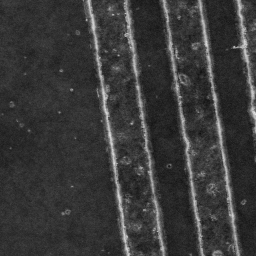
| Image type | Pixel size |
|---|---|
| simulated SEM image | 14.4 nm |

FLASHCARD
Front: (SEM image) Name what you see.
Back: one or a few lines or trenches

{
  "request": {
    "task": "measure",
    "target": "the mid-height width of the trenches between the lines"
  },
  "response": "550 nm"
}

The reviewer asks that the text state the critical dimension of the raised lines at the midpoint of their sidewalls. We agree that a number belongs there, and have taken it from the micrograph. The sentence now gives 511 nanometres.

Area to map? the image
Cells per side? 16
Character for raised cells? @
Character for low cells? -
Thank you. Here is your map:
------@@--@@@--@
------@@---@@--@
------@@---@@--@
------@@---@@--@
------@@---@@---
------@@@--@@---
-------@@--@@---
-------@@--@@@--
-------@@---@@--
-------@@---@@--
-------@@---@@--
-------@@@--@@--
-------@@@--@@--
--------@@--@@@-
--------@@--@@@-
--------@@---@@-